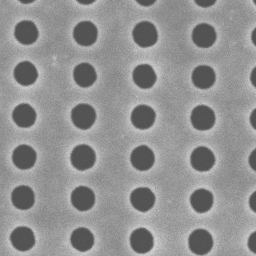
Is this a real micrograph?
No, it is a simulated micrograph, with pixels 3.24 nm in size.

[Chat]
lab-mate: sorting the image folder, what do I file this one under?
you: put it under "a regular array of holes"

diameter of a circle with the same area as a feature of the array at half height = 79.9 nm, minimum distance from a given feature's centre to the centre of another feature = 133 nm